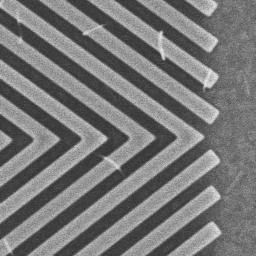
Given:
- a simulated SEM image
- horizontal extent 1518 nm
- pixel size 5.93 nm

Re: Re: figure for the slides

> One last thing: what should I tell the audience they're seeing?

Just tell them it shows groups of lines, slits or small figures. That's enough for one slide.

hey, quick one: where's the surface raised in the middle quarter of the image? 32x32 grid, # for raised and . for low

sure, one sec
....#######.....#######......###
.....#######......######......##
#......######......#######.....#
###.....#######......######.....
####......######......######....
#####......#######.....#######..
#######.....#######......######.
..######......######......######
...######......#######.....#####
....#######......######......###
......######......#######.....##
#......#######.....#######......
###.....#######......######.....
####......######......#######...
######.....#######......######..
#######......######......######.
..######......#######.....######
...#######.....#######......####
....#######.....#######.....####
....######......######.....#####
...######.....#######.....######
.#######.....######......######.
######......######.....#######..
#####.....#######.....######....
####.....######......######.....
##......######......######.....#
#......#######....#######.....##
.....#######.....######......###
....######......######.....#####
...######.....#######.....######
.#######.....######......######.
######......######.....#######..